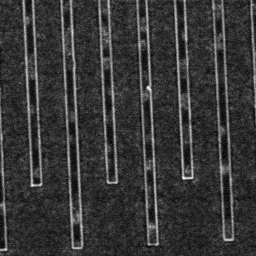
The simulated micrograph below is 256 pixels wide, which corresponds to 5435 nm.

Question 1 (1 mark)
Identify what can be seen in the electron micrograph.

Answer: parallel lines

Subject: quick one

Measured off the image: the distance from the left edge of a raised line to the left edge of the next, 804 nm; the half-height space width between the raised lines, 599 nm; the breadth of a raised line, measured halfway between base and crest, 199 nm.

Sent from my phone